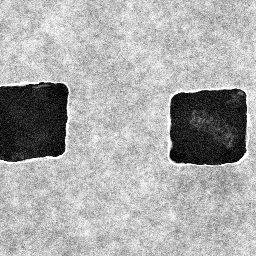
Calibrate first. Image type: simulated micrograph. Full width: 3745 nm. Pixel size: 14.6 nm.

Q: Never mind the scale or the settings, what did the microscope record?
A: holes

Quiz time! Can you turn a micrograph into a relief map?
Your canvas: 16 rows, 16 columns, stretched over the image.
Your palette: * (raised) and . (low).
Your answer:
****************
****************
****************
****************
****************
....************
....*******....*
....*******....*
....*******....*
....*******....*
****************
****************
****************
****************
****************
****************